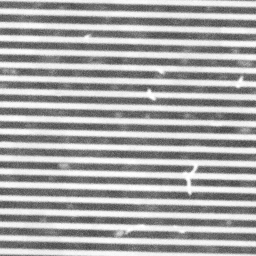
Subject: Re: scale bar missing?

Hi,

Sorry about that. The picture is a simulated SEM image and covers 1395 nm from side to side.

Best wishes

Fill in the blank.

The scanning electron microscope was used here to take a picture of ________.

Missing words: parallel lines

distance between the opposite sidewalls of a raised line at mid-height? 20.4 nm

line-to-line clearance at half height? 51.1 nm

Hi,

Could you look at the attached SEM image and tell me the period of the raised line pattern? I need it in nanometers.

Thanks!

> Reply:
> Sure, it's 72.6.